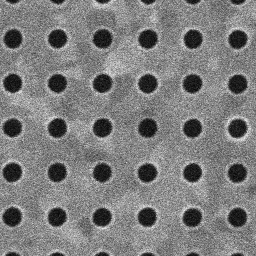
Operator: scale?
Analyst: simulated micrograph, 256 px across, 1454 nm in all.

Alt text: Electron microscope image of a regular array of holes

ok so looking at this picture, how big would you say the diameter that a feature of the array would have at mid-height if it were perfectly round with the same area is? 114 nanometers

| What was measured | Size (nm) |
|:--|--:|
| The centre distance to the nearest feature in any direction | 252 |